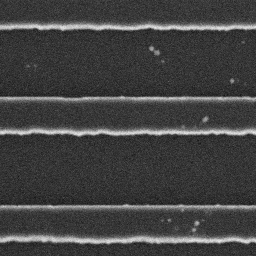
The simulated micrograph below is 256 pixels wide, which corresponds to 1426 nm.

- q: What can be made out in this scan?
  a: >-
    lines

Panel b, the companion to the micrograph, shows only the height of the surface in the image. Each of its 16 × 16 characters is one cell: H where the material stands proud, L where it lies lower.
HHHHHHHHHHHHHHHH
HHHHHHHHHHHHHHHH
LLLLLLLLLLLLLLLL
LLLLLLLLLLLLLLLL
LLLLLLLLLLLLLLLL
LLLLLLLLLLLLLLLL
HHHHHHHHHHHHHHHH
HHHHHHHHHHHHHHHH
LLLLLLLLLLLLLLLL
LLLLLLLLLLLLLLLL
LLLLLLLLLLLLLLLL
LLLLLLLLLLLLLLLL
LLLLLLLLLLLLLLLL
HHHHHHHHHHHHHHHH
HHHHHHHHHHHHHHHH
LLLLLLLLLLLLLLLL